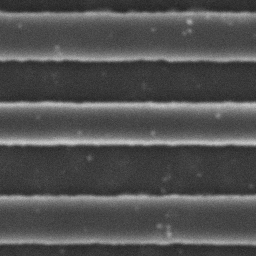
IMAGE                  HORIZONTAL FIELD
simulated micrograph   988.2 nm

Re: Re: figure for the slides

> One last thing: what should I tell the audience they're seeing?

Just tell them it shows lines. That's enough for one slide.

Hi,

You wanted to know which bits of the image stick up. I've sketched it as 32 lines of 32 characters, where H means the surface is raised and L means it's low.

LLLLLLLLLLLLLLLLLLLLLLLLLLLLLLLL
LLLLLLLLLLLLLLLLLLLLLLLLLLLLLLLL
HHHHHHHHHHHHHHHHHHHHHHHHHHHHHHHH
HHHHHHHHHHHHHHHHHHHHHHHHHHHHHHHH
HHHHHHHHHHHHHHHHHHHHHHHHHHHHHHHH
HHHHHHHHHHHHHHHHHHHHHHHHHHHHHHHH
HHHHHHHHHHHHHHHHHHHHHHHHHHHHHHHH
HLHLLHLHLHHHHHHHLLLLLHHHHLHHHHHH
LLLLLLLLLLLLLLLLLLLLLLLLLLLLLLLL
LLLLLLLLLLLLLLLLLLLLLLLLLLLLLLLL
LLLLLLLLLLLLLLLLLLLLLLLLLLLLLLLL
LLLLLLLLLLLLLLLLLLLLLLLLLLLLLLLL
LLLLLLLLLLLLLLLLLLLLLLLLLLLLLLLL
HHHHHHHHHHHHHHHHHHHHHHHHHHHHHHHH
HHHHHHHHHHHHHHHHHHHHHHHHHHHHHHHH
HHHHHHHHHHHHHHHHHHHHHHHHHHHHHHHH
HHHHHHHHHHHHHHHHHHHHHHHHHHHHHHHH
HHHHHHHHHHHHHHHHHHHHHHHHHHHHHHHH
LLLLLLLLLLLLLLLLLLLLLLLLLLLLLLLL
LLLLLLLLLLLLLLLLLLLLLLLLLLLLLLLL
LLLLLLLLLLLLLLLLLLLLLLLLLLLLLLLL
LLLLLLLLLLLLLLLLLLLLLLLLLLLLLLLL
LLLLLLLLLLLLLLLLLLLLLLLLLLLLLLLL
LLLLLLLLLLLLLLLLLLLLLLLLLLLLLLLL
LLLLLLLLLLLLLLLLLLLLLHLLLLLLLLLL
HHHHHHHHHHHHHHHHHHHHHHHHHHHHHHHH
HHHHHHHHHHHHHHHHHHHHHHHHHHHHHHHH
HHHHHHHHHHHHHHHHHHHHHHHHHHHHHHHH
HHHHHHHHHHHHHHHHHHHHHHHHHHHHHHHH
HHHHHHHHHHHHHHHHHHHHHHHHHHHHHHHH
LLLLLLLLLLLLLLLLLLLLLLLLLLLLLLLH
LLLLLLLLLLLLLLLLLLLLLLLLLLLLLLLL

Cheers